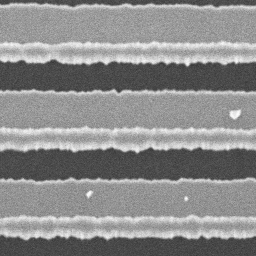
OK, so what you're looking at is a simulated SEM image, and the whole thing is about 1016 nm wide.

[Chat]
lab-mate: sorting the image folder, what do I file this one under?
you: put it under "lines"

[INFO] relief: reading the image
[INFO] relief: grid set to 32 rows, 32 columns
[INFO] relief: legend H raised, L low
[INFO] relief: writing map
LLLLLLLLLLLLLLLLLLLLLLLLLLLLLLLL
HHHHHHHHHHHHHHHHHHHHHHHHHHHHHHHH
HHHHHHHHHHHHHHHHHHHHHHHHHHHHHHHH
HHHHHHHHHHHHHHHHHHHHHHHHHHHHHHHH
HHHHHHHHHHHHHHHHHHHHHHHHHHHHHHHH
HHHHHHHHHHHHHHHHHHHHHHHHHHHHHHHH
HHHHHHHHHHHHHHHHHHHHHHHHHHHHHHHH
HHHHHHLHHHHHHHHHHHHHHHHHHHHHHHHH
LLLLLLLLLLLLLLLLLLLLLLLLLLLLLLLL
LLLLLLLLLLLLLLLLLLLLLLLLLLLLLLLL
LLLLLLLLLLLLLLLLLLLLLLLLLLLLLLLL
HHHHHHHHHHLHHHHHHHHHHHHHHHHHHHHH
HHHHHHHHHHHHHHHHHHHHHHHHHHHHHHHH
HHHHHHHHHHHHHHHHHHHHHHHHHHHHHHHH
HHHHHHHHHHHHHHHHHHHHHHHHHHHHHHHH
HHHHHHHHHHHHHHHHHHHHHHHHHHHHHHHH
HHHHHHHHHHHHHHHHHHHHHHHHHHHHHHHH
HHHHHHHHHHHHHHHHHHHHHHHHHHHHHHHH
HHHHHHHHHHHHHHHHHHHHHHHHHHHHHHHH
LLLLLLLLLLLLLLLLLLLLLLLLLLLLLLLL
LLLLLLLLLLLLLLLLLLLLLLLLLLLLLLLL
LLLLLLLLLLLLLLLLLLLLLLLLLLLLLLLL
HHHLLLLLHHHLHLLHHHLLHLHHHHLLLHHH
HHHHHHHHHHHHHHHHHHHHHHHHHHHHHHHH
HHHHHHHHHHHHHHHHHHHHHHHHHHHHHHHH
HHHHHHHHHHHHHHHHHHHHHHHHHHHHHHHH
HHHHHHHHHHHHHHHHHHHHHHHHHHHHHHHH
HHHHHHHHHHHHHHHHHHHHHHHHHHHHHHHH
HHHHHHHHHHHHHHHHHHHHHHHHHHHHHHHH
LHHHHHHLHHHHLHHHHHHHHHLHHHHHHHHH
LLLLLLLLLLLLLLLLLLLLLLLLLLLLLLLL
LLLLLLLLLLLLLLLLLLLLLLLLLLLLLLLL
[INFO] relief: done